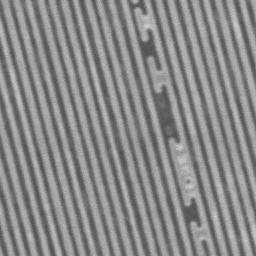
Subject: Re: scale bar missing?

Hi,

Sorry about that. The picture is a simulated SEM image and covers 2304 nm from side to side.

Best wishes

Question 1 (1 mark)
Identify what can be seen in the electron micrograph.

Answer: parallel lines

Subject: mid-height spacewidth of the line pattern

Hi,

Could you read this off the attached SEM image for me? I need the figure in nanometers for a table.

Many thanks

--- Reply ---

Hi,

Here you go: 64.3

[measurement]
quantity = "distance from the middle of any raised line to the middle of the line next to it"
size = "103 nanometres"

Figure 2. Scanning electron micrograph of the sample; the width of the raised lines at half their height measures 40.3 nm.